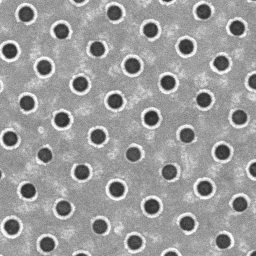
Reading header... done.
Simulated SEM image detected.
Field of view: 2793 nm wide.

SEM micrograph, a regular array of holes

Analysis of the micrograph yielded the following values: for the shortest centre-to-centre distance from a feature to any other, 424 nm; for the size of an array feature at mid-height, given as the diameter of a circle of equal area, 0.171 µm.